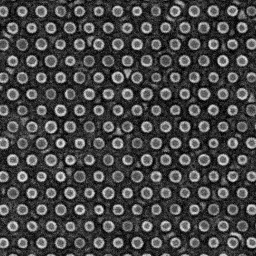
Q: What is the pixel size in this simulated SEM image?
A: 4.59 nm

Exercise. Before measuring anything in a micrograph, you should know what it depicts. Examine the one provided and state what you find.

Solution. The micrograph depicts a regular array of raised bodies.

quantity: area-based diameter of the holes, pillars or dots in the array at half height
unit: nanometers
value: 47.2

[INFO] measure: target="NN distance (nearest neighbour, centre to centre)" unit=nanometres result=85.9